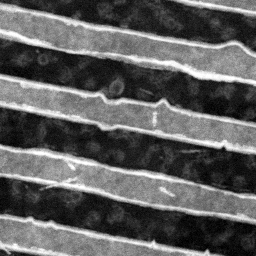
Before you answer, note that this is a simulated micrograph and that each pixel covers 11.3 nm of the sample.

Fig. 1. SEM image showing one or a few lines or trenches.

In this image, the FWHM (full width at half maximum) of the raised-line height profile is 291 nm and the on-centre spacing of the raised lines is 776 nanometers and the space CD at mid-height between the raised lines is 477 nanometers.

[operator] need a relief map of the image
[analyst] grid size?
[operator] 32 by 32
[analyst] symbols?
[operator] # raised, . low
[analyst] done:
..........................######
###.............................
########........................
############....................
..################..............
.....###################........
.........######################.
.................###############
.......................#########
.........................#######
####............................
#########.......................
#############...................
...##################...........
........#################.......
............##################..
...................#############
........................########
.............................###
######..........................
###########.....................
###############.................
.....################...........
..........################......
..............################..
...................#############
.........................#######
##.............................#
########........................
############....................
##################..............
.....##################.........